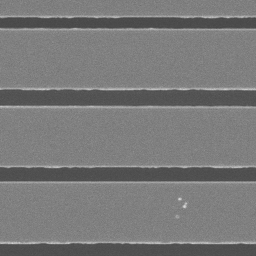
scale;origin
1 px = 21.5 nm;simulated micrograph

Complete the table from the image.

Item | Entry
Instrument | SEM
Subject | lines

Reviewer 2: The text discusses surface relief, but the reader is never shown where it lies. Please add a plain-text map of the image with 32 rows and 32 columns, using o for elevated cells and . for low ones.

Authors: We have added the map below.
oooooooooooooooooooooooooooooooo
oooooooooooooooooooooooooooooooo
................................
................................
oooooooooooooooooooooooooooooooo
oooooooooooooooooooooooooooooooo
oooooooooooooooooooooooooooooooo
oooooooooooooooooooooooooooooooo
oooooooooooooooooooooooooooooooo
oooooooooooooooooooooooooooooooo
oooooooooooooooooooooooooooooooo
................................
................................
oooooooooooooooooooooooooooooooo
oooooooooooooooooooooooooooooooo
oooooooooooooooooooooooooooooooo
oooooooooooooooooooooooooooooooo
oooooooooooooooooooooooooooooooo
oooooooooooooooooooooooooooooooo
oooooooooooooooooooooooooooooooo
oooooooooooooooooooooooooooooooo
................................
................................
oooooooooooooooooooooooooooooooo
oooooooooooooooooooooooooooooooo
oooooooooooooooooooooooooooooooo
oooooooooooooooooooooooooooooooo
oooooooooooooooooooooooooooooooo
oooooooooooooooooooooooooooooooo
oooooooooooooooooooooooooooooooo
................................
................................